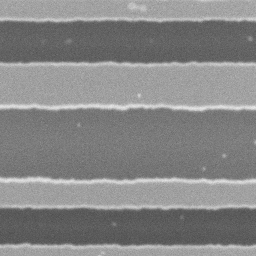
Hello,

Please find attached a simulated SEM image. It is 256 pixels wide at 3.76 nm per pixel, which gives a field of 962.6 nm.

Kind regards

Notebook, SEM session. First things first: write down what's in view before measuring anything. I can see lines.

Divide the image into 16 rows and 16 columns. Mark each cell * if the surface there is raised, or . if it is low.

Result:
****************
................
................
................
****************
****************
****************
................
................
................
................
****************
****************
................
................
****************